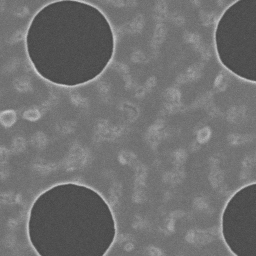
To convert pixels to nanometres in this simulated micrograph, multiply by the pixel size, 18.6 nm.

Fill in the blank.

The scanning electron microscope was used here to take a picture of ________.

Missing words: holes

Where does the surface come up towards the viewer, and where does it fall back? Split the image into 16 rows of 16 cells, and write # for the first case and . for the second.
###...########..
##.....#######..
##.....######...
##.....#######..
##....#########.
################
################
################
################
################
################
################
##....########..
##.....#######..
##.....#######..
##.....#######..